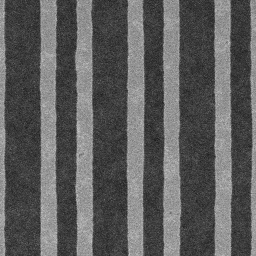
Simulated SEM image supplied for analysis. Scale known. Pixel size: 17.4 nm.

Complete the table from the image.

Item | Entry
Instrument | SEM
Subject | parallel lines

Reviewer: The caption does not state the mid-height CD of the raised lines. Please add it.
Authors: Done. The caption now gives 260 nm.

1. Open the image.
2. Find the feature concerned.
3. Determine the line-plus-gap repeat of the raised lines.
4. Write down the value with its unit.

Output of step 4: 43.6 pixels